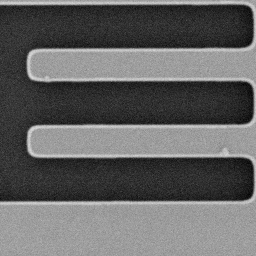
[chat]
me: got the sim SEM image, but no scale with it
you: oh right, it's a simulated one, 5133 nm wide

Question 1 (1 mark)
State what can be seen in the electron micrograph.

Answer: groups of lines, slits or small figures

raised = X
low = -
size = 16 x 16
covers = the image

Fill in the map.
----------------
----------------
----------------
--XXXXXXXXXXXXXX
--XXXXXXXXXXXXXX
----------------
----------------
----------------
--XXXXXXXXXXXXXX
--XXXXXXXXXXXXXX
----------------
----------------
----------------
XXXXXXXXXXXXXXXX
XXXXXXXXXXXXXXXX
XXXXXXXXXXXXXXXX